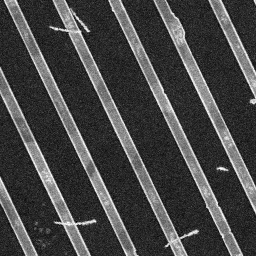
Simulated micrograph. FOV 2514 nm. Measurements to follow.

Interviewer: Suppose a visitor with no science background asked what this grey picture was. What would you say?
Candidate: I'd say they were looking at parallel lines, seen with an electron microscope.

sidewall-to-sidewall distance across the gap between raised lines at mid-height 332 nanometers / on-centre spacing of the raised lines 45.5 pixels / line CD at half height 97.3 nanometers